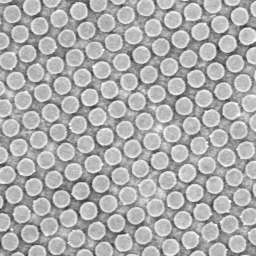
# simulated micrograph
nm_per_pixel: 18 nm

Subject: a regular array of raised bodies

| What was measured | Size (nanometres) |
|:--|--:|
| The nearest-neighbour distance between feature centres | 377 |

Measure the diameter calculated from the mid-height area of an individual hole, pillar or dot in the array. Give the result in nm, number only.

309